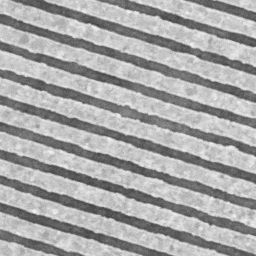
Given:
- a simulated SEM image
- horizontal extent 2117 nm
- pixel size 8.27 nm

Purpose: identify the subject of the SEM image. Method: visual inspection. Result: parallel lines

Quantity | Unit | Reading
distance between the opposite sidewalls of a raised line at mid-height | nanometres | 120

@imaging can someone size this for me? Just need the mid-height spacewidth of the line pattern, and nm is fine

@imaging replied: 95.8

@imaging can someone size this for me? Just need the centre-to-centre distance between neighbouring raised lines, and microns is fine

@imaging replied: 0.212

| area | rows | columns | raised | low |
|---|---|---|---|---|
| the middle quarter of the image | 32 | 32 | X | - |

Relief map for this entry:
------XXXXXXXXXXX----------XXXXX
--------XXXXXXXXXXXX----------XX
X----------XXXXXXXXXXXXX--------
XXXXX---------XXXXXXXXXXXXX-----
XXXXXXXXX----------XXXXXXXXXXX--
XXXXXXXXXXXX----------XXXXXXXXXX
---XXXXXXXXXXXX---------XXXXXXXX
------XXXXXXXXXXXX---------XXXXX
---------XXXXXXXXXXXXX---------X
XXX---------XXXXXXXXXXXX--------
XXXXXXX----------XXXXXXXXXXX----
XXXXXXXXXX---------XXXXXXXXXXXX-
XXXXXXXXXXXX----------XXXXXXXXXX
----XXXXXXXXXXX-----------XXXXXX
------XXXXXXXXXXXXX----------XXX
----------XXXXXXXXXXXX----------
XXXX---------XXXXXXXXXXXX-------
XXXXXXX----------XXXXXXXXXXXX---
XXXXXXXXXXX---------XXXXXXXXXXXX
--XXXXXXXXXXXX---------XXXXXXXXX
----XXXXXXXXXXXXX---------XXXXXX
-------XXXXXXXXXXXXX---------XXX
X----------XXXXXXXXXXX----------
XXXX----------XXXXXXXXXXXX------
XXXXXXX----------XXXXXXXXXXXXX--
XXXXXXXXXXX---------XXXXXXXXXXXX
--XXXXXXXXXXXX---------XXXXXXXXX
------XXXXXXXXXXX----------XXXXX
--------XXXXXXXXXXXX----------XX
XXX---------XXXXXXXXXXXXX-------
XXXXXX---------XXXXXXXXXXXX-----
XXXXXXXXX----------XXXXXXXXXXXX-